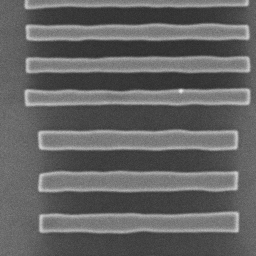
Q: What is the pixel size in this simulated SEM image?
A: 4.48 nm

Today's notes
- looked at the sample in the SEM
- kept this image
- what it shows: groups of lines, slits or small figures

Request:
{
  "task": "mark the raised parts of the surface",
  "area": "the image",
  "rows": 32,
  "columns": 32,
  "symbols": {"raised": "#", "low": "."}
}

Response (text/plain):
...############################.
................................
................................
...############################.
...############################.
................................
................................
...############################.
...############################.
................................
................................
...############################.
...############################.
................................
................................
................................
.....########################...
.....#########################..
.....########################...
................................
................................
.......##.....###...............
.....#########################..
.....########################...
................................
................................
................................
.....#########################..
.....#########################..
................................
................................
................................